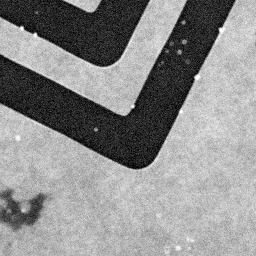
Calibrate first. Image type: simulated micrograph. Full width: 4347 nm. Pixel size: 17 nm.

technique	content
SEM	groups of lines, slits or small figures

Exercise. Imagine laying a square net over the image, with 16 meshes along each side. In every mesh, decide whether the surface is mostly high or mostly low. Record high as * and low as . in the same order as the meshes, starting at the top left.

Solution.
.....*...**....*
*........**...**
***.....**....**
*****...**...***
..*******...****
....*****...****
......**...*****
**.........*****
****......******
******....******
********.*******
****************
****************
****************
****************
****************